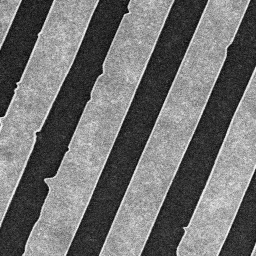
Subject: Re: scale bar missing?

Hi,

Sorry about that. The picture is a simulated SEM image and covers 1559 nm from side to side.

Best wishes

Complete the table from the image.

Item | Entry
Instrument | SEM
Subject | one or a few lines or trenches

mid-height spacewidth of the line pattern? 0.195 microns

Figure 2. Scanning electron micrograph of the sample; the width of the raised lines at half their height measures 236 nm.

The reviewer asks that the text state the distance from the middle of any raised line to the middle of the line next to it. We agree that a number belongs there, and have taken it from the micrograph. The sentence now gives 428 nm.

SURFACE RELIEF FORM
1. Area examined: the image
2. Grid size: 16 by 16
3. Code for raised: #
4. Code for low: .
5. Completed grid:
#..###..###..##.
#..##...##..###.
..###..###..###.
..###..##...##..
..##..###..###..
.###..###..##..#
.##..###..###..#
###..###..##...#
##...##..###..##
##..###..###..##
##..##...##..###
#..###..###..###
#..###..##..###.
..###..###..###.
..###..##...##..
..##..###..###..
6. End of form